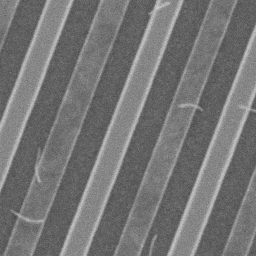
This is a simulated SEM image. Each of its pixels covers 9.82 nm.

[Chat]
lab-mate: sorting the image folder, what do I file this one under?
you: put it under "lines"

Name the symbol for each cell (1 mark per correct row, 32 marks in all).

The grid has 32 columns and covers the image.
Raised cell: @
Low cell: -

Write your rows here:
@@----@@@----@@@----@@@---@@@---
@@---@@@----@@@@---@@@----@@@---
@----@@@----@@@----@@@---@@@@---
@----@@@---@@@@---@@@@---@@@----
@---@@@----@@@@---@@@----@@@---@
----@@@----@@@----@@@---@@@@---@
----@@@---@@@@---@@@----@@@----@
---@@@----@@@----@@@----@@@---@@
---@@@---@@@@----@@@---@@@----@@
--@@@@---@@@@---@@@----@@@----@@
--@@@----@@@----@@@---@@@@---@@@
--@@@---@@@@---@@@@---@@@----@@@
-@@@----@@@----@@@----@@@---@@@@
-@@@----@@@----@@@---@@@@---@@@-
@@@@---@@@@---@@@----@@@----@@@-
@@@----@@@----@@@----@@@---@@@--
@@@---@@@@---@@@@---@@@----@@@--
@@----@@@@---@@@----@@@----@@@--
@@----@@@----@@@---@@@@---@@@---
@@---@@@@---@@@----@@@----@@@---
@----@@@----@@@----@@@---@@@@---
@---@@@@----@@@---@@@----@@@----
@---@@@@---@@@----@@@----@@@---@
----@@@----@@@---@@@@---@@@----@
---@@@@---@@@@---@@@----@@@----@
---@@@----@@@----@@@----@@@---@@
--@@@@----@@@---@@@@---@@@----@@
--@@@@---@@@----@@@----@@@---@@@
--@@@----@@@----@@@---@@@----@@@
-@@@@---@@@@---@@@----@@@----@@@
-@@@@---@@@----@@@----@@@---@@@-
-@@@----@@@---@@@@---@@@----@@@-